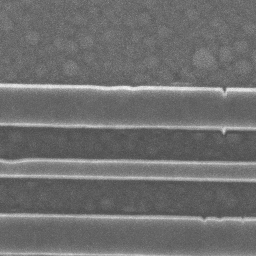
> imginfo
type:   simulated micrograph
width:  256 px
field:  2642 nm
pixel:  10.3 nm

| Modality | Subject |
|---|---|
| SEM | one or a few lines or trenches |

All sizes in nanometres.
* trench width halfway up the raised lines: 379